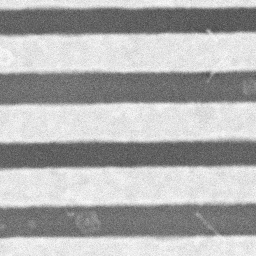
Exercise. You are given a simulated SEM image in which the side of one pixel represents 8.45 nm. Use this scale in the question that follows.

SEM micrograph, lines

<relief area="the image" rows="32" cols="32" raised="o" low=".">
oooooooooooooooooooooooooooooooo
................................
................................
................................
...ooooooooooooooooooooooooooooo
oooooooooooooooooooooooooooooooo
oooooooooooooooooooooooooooooooo
oooooooooooooooooooooooooooooooo
oooooooooooooooooooooooooooooooo
................................
................................
................................
................................
oooooooooooooooooooooooooooooooo
oooooooooooooooooooooooooooooooo
oooooooooooooooooooooooooooooooo
oooooooooooooooooooooooooooooooo
oooooooooooooooooooooooooooo....
................................
................................
................................
oooooooooooooooooooooooooooooooo
oooooooooooooooooooooooooooooooo
oooooooooooooooooooooooooooooooo
oooooooooooooooooooooooooooooooo
oooooooooooooooooooo............
................................
................................
................................
...........................o....
oooooooooooooooooooooooooooooooo
oooooooooooooooooooooooooooooooo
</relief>